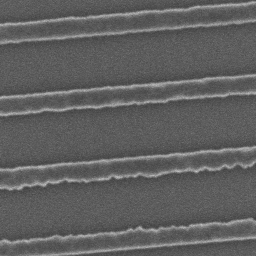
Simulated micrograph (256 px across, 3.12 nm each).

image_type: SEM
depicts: one or a few lines or trenches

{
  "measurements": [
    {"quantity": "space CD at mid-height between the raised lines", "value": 168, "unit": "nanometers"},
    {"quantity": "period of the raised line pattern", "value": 225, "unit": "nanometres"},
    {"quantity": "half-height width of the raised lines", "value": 55.9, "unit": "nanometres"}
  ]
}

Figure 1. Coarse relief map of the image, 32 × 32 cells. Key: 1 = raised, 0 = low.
00000000000000000000000000000011
00000000000000000011111111111111
00000001111111111111111111111111
11111111111111111111111000000000
11111111110000000000000000000000
00000000000000000000000000000000
00000000000000000000000000000000
00000000000000000000000000000000
00000000000000000000000000000000
00000000000000000000000000000001
00000000000000000001111111111111
00000000111111111111111111111111
11111111111111111111100000000000
11111111100000000000000000000000
00000000000000000000000000000000
00000000000000000000000000000000
00000000000000000000000000000000
00000000000000000000000000000000
00000000000000000000000000000001
00000000000000000001111111111111
00000001111111111111111111111111
11111111111111111111100000000000
11111111111110000000000000000000
11100000000000000000000000000000
00000000000000000000000000000000
00000000000000000000000000000000
00000000000000000000000000000000
00000000000000000000000000000001
00000000000000000000111111111111
00000000111111111111111111111111
11111111111111111111111000000000
11111111111000000000000000000000